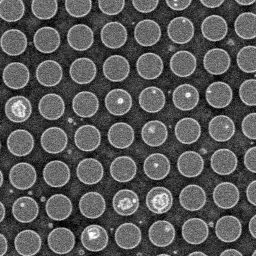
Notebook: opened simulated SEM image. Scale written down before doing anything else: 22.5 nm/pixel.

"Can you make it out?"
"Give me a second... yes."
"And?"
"an array of small figures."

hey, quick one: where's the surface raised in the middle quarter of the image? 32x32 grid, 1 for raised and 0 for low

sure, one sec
00111111001111110011111110011111
00111111001111110011111100011111
00111111001111110001111100001111
00111110000111100000111000000000
00011100000000000000000000000000
00000000000000000000000000000111
00000000000001000000111100001111
00001110000111110001111110011111
00011111000111111001111110011111
00111111001111111001111110011111
00111111000111111001111110001111
00011111000111110000111100000000
00011110000011100000000000000000
00000000000000000000000000000000
00000000000000000000011100000111
00000110000011110000111110001111
00011111000111111000111111001111
00011111100111111000111111001111
10011111100111111000111110001111
10011111100011111000111110000111
00011111000001110000000000000000
00000110000000000000000000000000
00000000000000000000000000000011
00000000000000110000011111000111
00001111100011111000111111001111
10001111100011111100111111001111
10011111110011111100111111000111
10011111110011111100011111000011
10001111100001111000001100000000
10000111000000000000000000000000
00000000000000000000000000000001
00000000000000000000001111000011